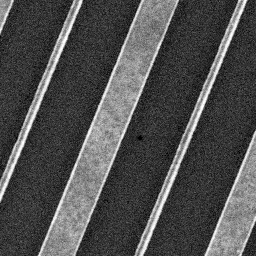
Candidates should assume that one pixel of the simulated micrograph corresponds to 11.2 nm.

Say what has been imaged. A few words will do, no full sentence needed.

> lines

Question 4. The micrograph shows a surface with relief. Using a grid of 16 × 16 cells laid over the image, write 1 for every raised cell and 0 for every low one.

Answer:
1000000001100000
0000000011100000
0000000011000000
0000000111000000
0000000110000000
0000000110000000
0000001110000000
0000001100000000
0000011100000000
0000011000000001
0000011000000001
0000110000000001
0000110000000011
0001110000000011
0001100000000111
0001100000000110